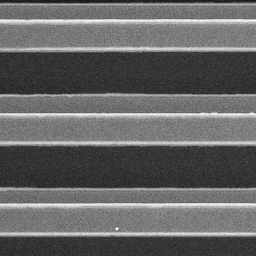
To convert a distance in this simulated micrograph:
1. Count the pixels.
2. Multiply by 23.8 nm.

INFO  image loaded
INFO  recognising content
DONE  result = lines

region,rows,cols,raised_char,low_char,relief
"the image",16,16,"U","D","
UUUUUUUUUUUUUUUU
UUUUUUUUUUUUUUUU
UUUUUUUUUUUUUUUU
DDDDDDDDDDDDDDDD
DDDDDDDDDDDDDDDD
DDDDDDDDDDDDDDDD
UUUUUUUUUUUUUUUU
UUUUUUUUUUUUUUUU
UUUUUUUUUUUUUUUU
DDDDDDDDDDDDDDDD
DDDDDDDDDDDDDDDD
DDDDDDDDDDDDDDDD
UUUUUUUUUUUUUUUU
UUUUUUUUUUUUUUUU
UUUUUUUUUUUUUUUU
DDDDDDDDDDDDDDDD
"